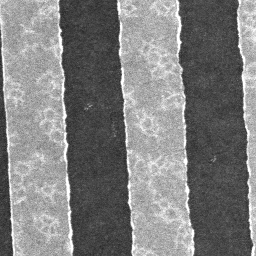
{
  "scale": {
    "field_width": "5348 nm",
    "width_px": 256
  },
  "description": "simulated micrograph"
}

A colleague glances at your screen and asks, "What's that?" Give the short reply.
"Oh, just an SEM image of one or a few lines or trenches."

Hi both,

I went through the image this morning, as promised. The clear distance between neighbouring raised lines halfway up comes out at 1260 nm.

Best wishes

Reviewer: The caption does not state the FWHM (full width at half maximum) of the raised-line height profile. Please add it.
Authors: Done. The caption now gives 58.5 px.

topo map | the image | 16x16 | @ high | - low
@@@@---@@@@----@
@@@@----@@@----@
@@@@----@@@----@
@@@@----@@@----@
@@@@----@@@----@
@@@@----@@@----@
@@@@----@@@@---@
@@@@----@@@@---@
@@@@----@@@@---@
-@@@----@@@@---@
-@@@----@@@@----
-@@@----@@@@----
-@@@----@@@@----
-@@@----@@@@----
-@@@----@@@@----
-@@@----@@@@----